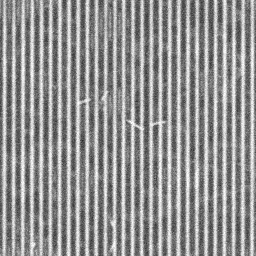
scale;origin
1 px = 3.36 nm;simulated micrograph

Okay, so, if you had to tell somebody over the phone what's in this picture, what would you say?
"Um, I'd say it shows parallel lines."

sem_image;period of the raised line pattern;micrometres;0.0309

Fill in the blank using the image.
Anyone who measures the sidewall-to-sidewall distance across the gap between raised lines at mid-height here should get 23.1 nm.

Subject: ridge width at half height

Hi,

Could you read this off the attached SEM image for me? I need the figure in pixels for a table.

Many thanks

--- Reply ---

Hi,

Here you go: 2.5